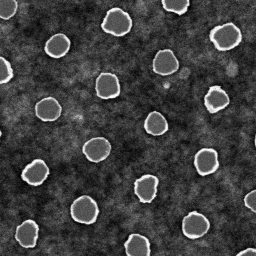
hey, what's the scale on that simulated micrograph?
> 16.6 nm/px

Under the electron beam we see a regular array of raised bodies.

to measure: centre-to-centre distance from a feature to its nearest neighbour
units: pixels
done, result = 62.1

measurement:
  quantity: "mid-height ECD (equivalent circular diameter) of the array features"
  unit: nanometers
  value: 411